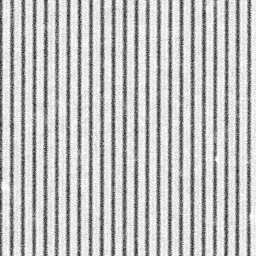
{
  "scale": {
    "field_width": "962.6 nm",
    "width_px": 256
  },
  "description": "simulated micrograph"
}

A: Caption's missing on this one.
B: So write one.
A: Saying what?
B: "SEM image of parallel lines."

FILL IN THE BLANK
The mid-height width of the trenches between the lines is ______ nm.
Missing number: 20.7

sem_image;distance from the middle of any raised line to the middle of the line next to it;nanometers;42.5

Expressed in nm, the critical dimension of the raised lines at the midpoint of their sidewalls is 20.7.